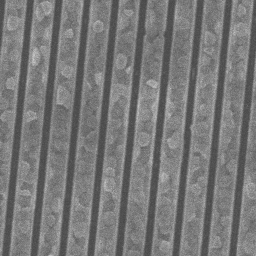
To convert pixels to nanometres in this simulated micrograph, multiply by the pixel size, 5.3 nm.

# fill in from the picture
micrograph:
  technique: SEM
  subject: parallel lines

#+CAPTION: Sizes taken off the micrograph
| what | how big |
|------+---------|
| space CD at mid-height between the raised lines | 0.0402 microns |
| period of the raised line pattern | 0.15 µm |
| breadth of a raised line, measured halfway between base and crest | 0.11 micrometres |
